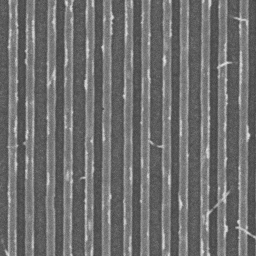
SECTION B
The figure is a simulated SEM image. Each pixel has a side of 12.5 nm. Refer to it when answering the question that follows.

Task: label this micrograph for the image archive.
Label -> parallel lines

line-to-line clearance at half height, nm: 131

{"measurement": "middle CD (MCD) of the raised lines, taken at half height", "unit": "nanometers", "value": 98.6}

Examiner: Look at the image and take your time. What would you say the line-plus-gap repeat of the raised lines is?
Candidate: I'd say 241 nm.